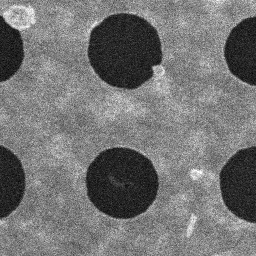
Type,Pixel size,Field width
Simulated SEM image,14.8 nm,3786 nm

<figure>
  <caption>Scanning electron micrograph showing holes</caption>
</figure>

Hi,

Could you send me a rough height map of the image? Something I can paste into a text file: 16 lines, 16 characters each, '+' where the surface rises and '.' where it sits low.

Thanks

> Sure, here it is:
++++++++++++++++
.+++++...++++++.
.+++++....++++..
.+++++....++++..
.+++++....++++..
++++++++++++++++
++++++++++++++++
++++++++++++++++
++++++++++++++++
.+++++...++++++.
.+++++....++++..
..+++.....++++..
.+++++....++++..
+++++++..++++++.
++++++++++++++++
++++++++++++++++